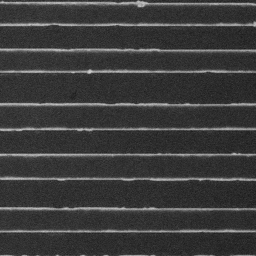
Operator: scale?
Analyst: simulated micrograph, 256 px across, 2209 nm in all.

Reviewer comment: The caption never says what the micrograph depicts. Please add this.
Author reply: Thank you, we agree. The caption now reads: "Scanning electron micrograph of lines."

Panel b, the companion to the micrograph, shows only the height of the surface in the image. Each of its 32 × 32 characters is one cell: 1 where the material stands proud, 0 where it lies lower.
11111111111111111111111111111111
11111111111111111111111111111111
11111111111111111111111111111111
00000000000000000000000000000000
00000000000000000000000000000000
00000000000000000000000000000000
11111111111111111111111111111111
11111111111111111111111111111111
11111111111111111111111111111111
00000000000000000000000000000000
00000000000000000000000000000000
00000000000000000000000000000000
00000000000000000000000000000000
11111111111111111111111111111111
11111111111111111111111111111111
11111111111111111111111111111111
00000000000000000000000000000000
00000000000000000000000000000000
00000000000000000000000000000000
11111111111111111111111111111111
11111111111111111111111111111111
11111111111111111111111111111111
00000000000000000000000000000000
00000000000000000000000000000000
00000000000000000000000000000000
00000000000000000000000000000000
11111111111111111111111111111111
11111111111111111111111111111111
11111111111111111111111111111111
00000000000000000000000000000000
00000000000000000000000000000000
00000000000000000000000000000000